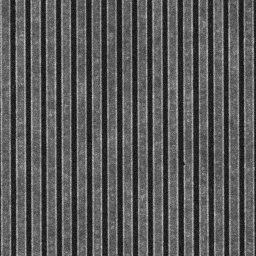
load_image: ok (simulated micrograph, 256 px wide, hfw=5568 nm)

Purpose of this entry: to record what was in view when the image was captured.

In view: parallel lines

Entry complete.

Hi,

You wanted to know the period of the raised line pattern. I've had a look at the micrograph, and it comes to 331 nm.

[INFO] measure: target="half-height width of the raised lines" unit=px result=9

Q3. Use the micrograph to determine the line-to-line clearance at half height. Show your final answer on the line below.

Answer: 136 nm